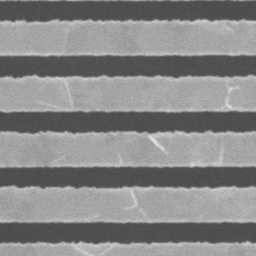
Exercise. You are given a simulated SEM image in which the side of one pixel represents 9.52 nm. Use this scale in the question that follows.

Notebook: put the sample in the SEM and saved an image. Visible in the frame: lines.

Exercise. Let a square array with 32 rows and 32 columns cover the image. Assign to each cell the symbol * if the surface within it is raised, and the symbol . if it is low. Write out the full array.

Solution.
................................
................................
................................
********************************
********************************
********************************
********************************
................................
................................
...............................*
********************************
********************************
********************************
********************************
................................
................................
**...**.......***....**...*.*..*
********************************
********************************
********************************
********************************
................................
................................
**.**.***.**...********.**.***.*
********************************
********************************
********************************
********************************
................................
................................
***********.***.****************
********************************